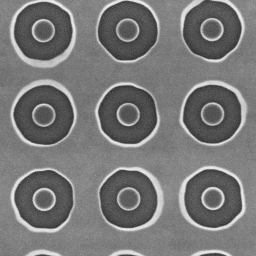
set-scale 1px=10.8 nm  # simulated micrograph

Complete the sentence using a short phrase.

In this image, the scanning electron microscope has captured an array of small figures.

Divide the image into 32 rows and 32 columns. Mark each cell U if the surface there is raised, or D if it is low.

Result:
UUUUDDDUUUUUUUDDDDUUUUUUDDDDDUUU
UUDDDDDDDUUUUDDDDDDUUUUDDDDDDDUU
UUDDDDDDDUUUDDDDDDDDUUUDDDUDDDUU
UUDDUUUDDUUUDDDUUDDDUUUDDUUUDDUU
UUDDUUUDDUUUDDDUUDDDUUUDDDUDDDUU
UUDDDDDDDUUUUDDDDDDUUUUDDDDDDDUU
UUDDDDDDUUUUUUDDDDUUUUUUDDDDDUUU
UUUDDDDUUUUUUUUDDUUUUUUUUUDUUUUU
UUUUUUUUUUUUUUUUUUUUUUUUUUUUUUUU
UUUUUUUUUUUUUUUUUUUUUUUUUUUUUUUU
UUUUUDDUUUUUUUUUUUUUUUUUUUDDUUUU
UUUDDDDDUUUUUDDDDDUUUUUUDDDDDUUU
UUDDDDDDDUUUUDDDDDDUUUUDDDDDDDUU
UUDDDUDDDUUUDDDUUDDDUUUDDUUUDDUU
UUDDUUUDDUUUDDDUUDDDUUUDDUUUDDUU
UUDDDUDDDUUUDDDDUDDDUUUDDDUDDDUU
UUDDDDDDDUUUUDDDDDDUUUUUDDDDDDUU
UUUDDDDDUUUUUUDDDDUUUUUUUDDDDUUU
UUUUUUUUUUUUUUUUUUUUUUUUUUUUUUUU
UUUUUUUUUUUUUUUUUUUUUUUUUUUUUUUU
UUUUUUUUUUUUUUUUUUUUUUUUUUUUUUUU
UUUUDDDUUUUUUUDDDDUUUUUUUDDDUUUU
UUUDDDDDUUUUUDDDDDDUUUUDDDDDDDUU
UUDDDDDDDUUUUDDDDDDDUUUDDDDDDDUU
UUDDUUUDDUUUDDDUUDDDUUUDDUUUDDUU
UUDDUUUDDUUUUDDUUDDDUUUDDDUUDDUU
UUDDDDDDDUUUUDDDDDDDUUUDDDDDDDUU
UUUDDDDDUUUUUDDDDDDUUUUUDDDDDUUU
UUUUDDDUUUUUUUUDDUUUUUUUUUDUUUUU
UUUUUUUUUUUUUUUUUUUUUUUUUUUUUUUU
UUUUUUUUUUUUUUUUUUUUUUUUUUUUUUUU
UUUUUUUUUUUUUUUUUUUUUUUUUUDUUUUU